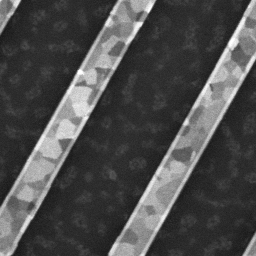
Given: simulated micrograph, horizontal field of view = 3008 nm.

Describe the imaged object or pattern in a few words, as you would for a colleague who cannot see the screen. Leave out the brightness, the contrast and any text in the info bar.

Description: one or a few lines or trenches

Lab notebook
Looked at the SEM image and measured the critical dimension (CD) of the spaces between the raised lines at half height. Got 1030 nanometres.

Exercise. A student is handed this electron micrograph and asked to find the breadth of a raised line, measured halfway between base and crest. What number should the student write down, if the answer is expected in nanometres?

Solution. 340